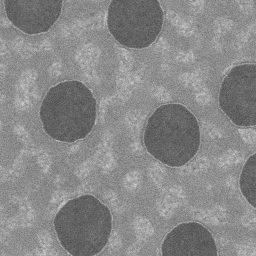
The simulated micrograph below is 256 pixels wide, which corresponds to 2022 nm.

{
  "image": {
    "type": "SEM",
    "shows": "raised bodies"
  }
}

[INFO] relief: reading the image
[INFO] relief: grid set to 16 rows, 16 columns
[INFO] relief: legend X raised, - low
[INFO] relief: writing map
XXXX---XXX------
-XX----XXX------
-------XXX------
----------------
--------------XX
---XXX--------XX
---XXX----X---XX
---XXX---XXX--XX
---XX----XXXX---
---------XXX----
---------------X
---------------X
----XX---------X
---XXXX---------
---XXXX----XX---
----XX----XXXX--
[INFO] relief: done